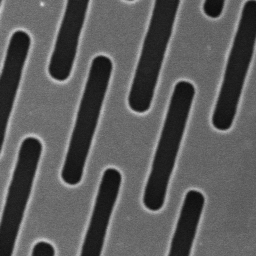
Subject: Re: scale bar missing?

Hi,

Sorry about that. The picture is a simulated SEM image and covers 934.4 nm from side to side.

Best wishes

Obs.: holes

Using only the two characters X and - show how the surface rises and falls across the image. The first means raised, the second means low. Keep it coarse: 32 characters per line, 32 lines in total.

XXXXXXXX---XXXXXXXX---XXX---XXX-
XXXXXXXX---XXXXXXXX---XXXX--XX--
XXXXXXXX---XXXXXXXX---XXXXXXXX--
XXXXXXX---XXXXXXXXX---XXXXXXXX--
X---XXX---XXXXXXXX---XXXXXXXX---
X---XXX---XXXXXXXX---XXXXXXXX---
X---XXX---XXXXXXXX---XXXXXXXX---
X--XXX---XXX--XXX---XXXXXXXX---X
---XXX---XX---XXX---XXXXXXXX---X
---XXX---XX---XXX---XXXXXXXX---X
--XXXXXXXXX---XX----XX--XXXX--XX
--XXXXXXXX---XXX---XXX--XXX---XX
--XXXXXXXX---XXX---XX---XXX---XX
-XXXXXXXXX---XXX---XX---XXX---XX
-XXXXXXXXX--XXXXXXXXX--XXXX--XXX
-XXXXXXXX---XXXXXXXX---XXXX--XXX
-XXXXXXXX---XXXXXXXX---XXXXXXXXX
XXX--XXXX---XXXXXXXX---XXXXXXXXX
XX---XXXX--XXXXXXXXX--XXXXXXXXXX
XX---XXX---XXXXXXXX---XXXXXXXXXX
XX---XXX---XXXXXXXX---XXXXXXXXXX
XX--XXXX--XXX--XXXX--XXXXXXXXXXX
X---XXXX--XXX--XXX---XXXXXXXXXXX
X---XXXXXXXX---XXX---XXXXXXXXXXX
X---XXXXXXXX---XXX---XX--XXXXXXX
X--XXXXXXXXX--XXXX--XXX--XXXXXXX
---XXXXXXXXX--XXXXXXXXX--XXXXXXX
---XXXXXXXX---XXXXXXXX---XXXXXXX
---XXXXXXXX--XXXXXXXXX---XXXXXXX
--XXXXXXXXX--XXXXXXXXX--XXXXXXXX
--XX--XXXX---XXXXXXXX---XXXXXXXX
--XX---XXX---XXXXXXXX---XXXXXXXX